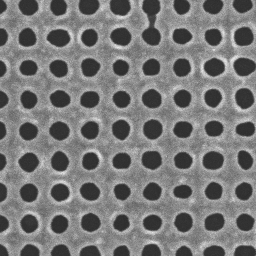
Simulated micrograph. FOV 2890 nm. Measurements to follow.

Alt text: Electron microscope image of a regular array of holes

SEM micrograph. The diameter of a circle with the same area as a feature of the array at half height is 210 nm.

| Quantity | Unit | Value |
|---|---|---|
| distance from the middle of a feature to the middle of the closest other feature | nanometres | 342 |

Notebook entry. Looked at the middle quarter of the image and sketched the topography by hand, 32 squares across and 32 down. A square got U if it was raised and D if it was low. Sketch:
DUUUDDDDDUUUDDDDUUUUDDDDUUUDDDDD
DUUUDDDDDUUUDDDDUUUUDDDDUUUDDDDD
DUUUUDDDUUUUUDDDUUUUDDDUUUUUDDDU
UUUUUUUUUUUUUUUUUUUUUUUUUUUUUUUU
UUUUUUUUUUUUUUUUUUUUUUUUUUUUUUUU
UUUUUUUUUUUUUUUUUUUUUUUUUUUUUUUU
UUUUUUUUUUUUUUUUUUUUUDDUUUUUUDUU
DUUUUDDDDUUUDDDDUUUUDDDDUUUUDDDD
DDUUDDDDDUUUDDDDDUUDDDDDUUUDDDDD
DUUUDDDDDUUUDDDDDUUUDDDDUUUUDDDD
DUUUDDDDUUUUUDDDUUUUDDDDUUUUDDDU
UUUUUUUUUUUUUUUUUUUUUUUUUUUUUUUU
UUUUUUUUUUUUUUUUUUUUUUUUUUUUUUUU
UUUUUUUUUUUUUUUUUUUUUUUUUUUUUUUU
UUUUUUDDUUUUDDDDUUUUDDDDUUUUDDDU
DUUUDDDDDUUUDDDDUUUUDDDDDUUUDDDD
DUUUDDDDDUUUDDDDDUUUDDDDDUUDDDDD
DUUUDDDDDUUUDDDDUUUUDDDDUUUDDDDD
DUUUUDDDUUUUUDDDUUUUUDDUUUUUUDDU
UUUUUUUUUUUUUUUUUUUUUUUUUUUUUUUU
UUUUUUUUUUUUUUUUUUUUUUUUUUUUUUUU
UUUUUUUUUUUUUUUUUUUUUUUUUUUUUUUU
UUUUUDDDUUUUUDDDUUUUDDDDUUUUDDDU
DUUUUDDDDUUUDDDDDUUDDDDDDUUDDDDD
DUUUDDDDDUUUDDDDDUUDDDDDDUUDDDDD
DUUUUDDDUUUUDDDDUUUUDDDDUUUUDDDD
DUUUUUUUUUUUUUUUUUUUUUDUUUUUUUUU
UUUUUUUUUUUUUUUUUUUUUUUUUUUUUUUU
UUUUUUUUUUUUUUUUUUUUUUUUUUUUUUUU
UUUUUUUUUUUUUUUUUUUUUUUUUUUUUUUU
DUUUDDDDUUUUUDDDUUUUUDDDUUUUDDDU
DUUUDDDDDUUUDDDDDUUUDDDDDUUDDDDD